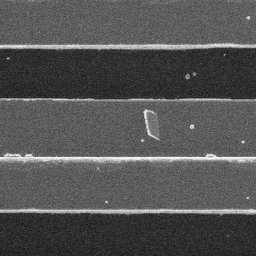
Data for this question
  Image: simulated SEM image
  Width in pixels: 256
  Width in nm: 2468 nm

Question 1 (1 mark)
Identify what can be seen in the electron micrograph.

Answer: lines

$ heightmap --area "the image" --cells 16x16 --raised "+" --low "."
++++++++++++++++
++++++++++++++++
++++++++++++++++
................
................
................
++++++++++++++++
++++++++++++++++
++++++++++++++++
++++++++++++++++
++++++++++++++++
++++++++++++++++
++++++++++++++++
................
................
................